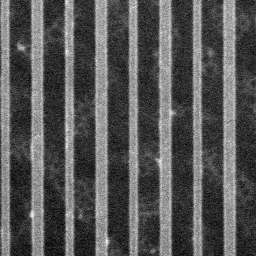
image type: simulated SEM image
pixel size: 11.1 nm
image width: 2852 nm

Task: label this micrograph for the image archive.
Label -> parallel lines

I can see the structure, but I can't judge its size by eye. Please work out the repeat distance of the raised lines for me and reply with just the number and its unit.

355 nanometers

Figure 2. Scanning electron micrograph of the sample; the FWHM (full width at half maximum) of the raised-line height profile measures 274 nanometres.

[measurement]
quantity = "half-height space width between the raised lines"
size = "61.3 nanometres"